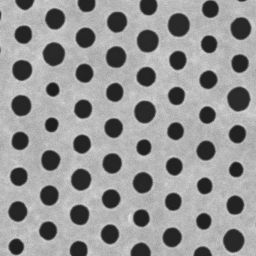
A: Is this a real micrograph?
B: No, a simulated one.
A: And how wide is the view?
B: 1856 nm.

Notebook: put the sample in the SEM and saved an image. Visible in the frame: a regular array of holes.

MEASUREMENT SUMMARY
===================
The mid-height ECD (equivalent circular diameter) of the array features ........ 137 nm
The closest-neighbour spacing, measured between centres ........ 256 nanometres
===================